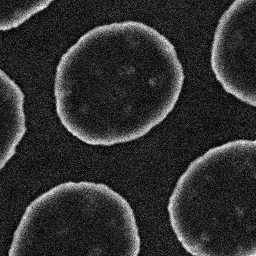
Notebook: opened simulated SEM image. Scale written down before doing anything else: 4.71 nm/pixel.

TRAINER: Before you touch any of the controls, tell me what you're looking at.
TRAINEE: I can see raised bodies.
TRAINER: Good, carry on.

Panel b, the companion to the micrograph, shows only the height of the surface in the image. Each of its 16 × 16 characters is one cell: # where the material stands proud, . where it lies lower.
###...........##
#.............##
.....#####....##
....#######..###
....#######..###
#...#######...##
#...#######.....
#...######......
#....####.......
#............###
............####
...........#####
..######...#####
..######...#####
.#######...#####
.########...####